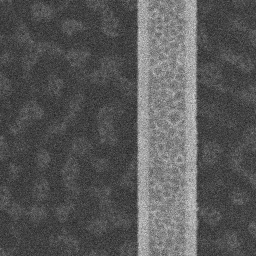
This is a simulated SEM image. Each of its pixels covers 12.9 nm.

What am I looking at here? one or a few lines or trenches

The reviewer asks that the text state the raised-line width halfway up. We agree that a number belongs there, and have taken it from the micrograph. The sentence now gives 0.632 µm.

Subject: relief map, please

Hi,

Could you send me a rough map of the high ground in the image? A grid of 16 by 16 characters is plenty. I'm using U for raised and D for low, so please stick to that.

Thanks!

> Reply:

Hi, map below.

DDDDDDDDDUUUDDDD
DDDDDDDDDUUUDDDD
DDDDDDDDDUUUDDDD
DDDDDDDDDUUUDDDD
DDDDDDDDDUUUDDDD
DDDDDDDDDUUUDDDD
DDDDDDDDDUUUDDDD
DDDDDDDDDUUUDDDD
DDDDDDDDDUUUDDDD
DDDDDDDDDUUUDDDD
DDDDDDDDDUUUDDDD
DDDDDDDDDUUUDDDD
DDDDDDDDDUUUDDDD
DDDDDDDDDUUUDDDD
DDDDDDDDDUUUDDDD
DDDDDDDDDUUUDDDD